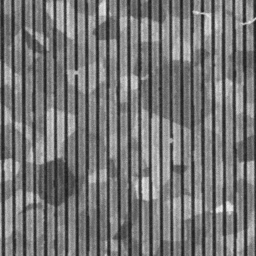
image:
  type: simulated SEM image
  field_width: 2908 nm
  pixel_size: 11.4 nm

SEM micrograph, parallel lines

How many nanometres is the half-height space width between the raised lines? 49.7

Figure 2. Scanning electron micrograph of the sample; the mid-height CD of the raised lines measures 73.9 nanometres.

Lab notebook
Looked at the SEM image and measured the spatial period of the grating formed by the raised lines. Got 120 nanometres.